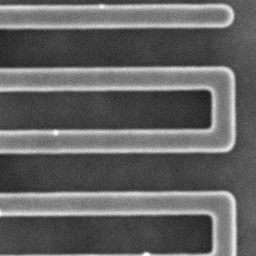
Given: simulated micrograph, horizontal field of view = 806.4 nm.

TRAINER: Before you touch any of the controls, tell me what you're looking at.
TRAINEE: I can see groups of lines, slits or small figures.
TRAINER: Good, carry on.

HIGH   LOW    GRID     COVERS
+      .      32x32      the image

................................
+++++++++++++++++++++++++++++...
+++++++++++++++++++++++++++++...
.++.............................
................................
................................
................................
................................
.......................+++++....
+++++++++++++++++++++++++++++...
+++++++++++++++++++++++++++++...
..........................+++...
...........................++...
...........................++...
...........................++...
...........................++...
+++++++++++++++++++++++++++++...
+++++++++++++++++++++++++++++...
+++++++++++++++++++++++++++++...
................................
................................
................................
................................
................................
+++++++++++++++++++++++++++++...
+++++++++++++++++++++++++++++...
+++++++++++++++++++++++++++++...
...........................++...
...........................++...
...........................++...
...........................++...
..........................+++...